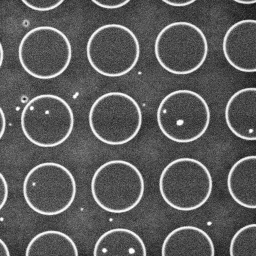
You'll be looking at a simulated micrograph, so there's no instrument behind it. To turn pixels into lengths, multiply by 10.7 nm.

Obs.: an array of small figures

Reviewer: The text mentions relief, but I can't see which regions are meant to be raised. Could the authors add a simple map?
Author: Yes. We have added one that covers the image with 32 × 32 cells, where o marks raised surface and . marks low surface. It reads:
...oooo.....oooo.....ooo........
................................
................................
.....oo......ooo.....oooo....ooo
...ooooo...oooooo...ooooo...oooo
...oooooo..oooooo..ooooooo..oooo
..ooooooo..oooooo..ooooooo..oooo
...oooooo..oooooo...ooooo....ooo
...ooooo....oooo.....oooo.....oo
....ooo.........................
................................
......................oo......oo
....oooo....ooooo...ooooo....ooo
...oooooo..oooooo...oooooo..oooo
o..oooooo..ooooooo..oooooo..oooo
o..oooooo..ooooooo..oooooo..oooo
...oooooo...ooooo...ooooo....ooo
....oooo.....ooo......oo........
................................
................................
.....oo......ooo.....oooo....ooo
....ooooo...ooooo...oooooo...ooo
o..oooooo...oooooo..oooooo...ooo
o..oooooo...oooooo..oooooo...ooo
o..oooooo...oooooo..oooooo...ooo
....ooooo...ooooo....oooo.....oo
.....ooo......o.................
................................
......................oo......oo
.....ooo.....oooo....ooooo...ooo
o...ooooo...oooooo..ooooooo..ooo
o..ooooooo..oooooo..ooooooo..ooo